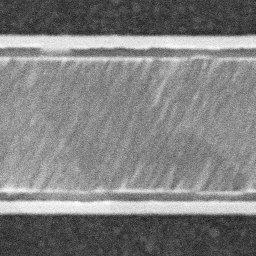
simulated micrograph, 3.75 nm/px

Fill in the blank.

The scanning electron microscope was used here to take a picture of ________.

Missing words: one or a few lines or trenches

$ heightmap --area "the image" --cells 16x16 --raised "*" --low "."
................
................
................
****************
****************
****************
****************
****************
****************
****************
****************
****************
****************
................
................
................